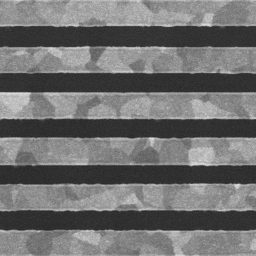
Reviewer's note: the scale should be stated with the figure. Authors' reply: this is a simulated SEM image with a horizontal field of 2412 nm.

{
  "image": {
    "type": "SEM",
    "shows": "lines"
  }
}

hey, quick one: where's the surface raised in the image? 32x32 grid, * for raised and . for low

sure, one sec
********************************
********************************
********************************
................................
................................
................................
********************************
********************************
********************************
................................
................................
................................
********************************
********************************
********************************
................................
................................
********************************
********************************
********************************
********************************
................................
................................
********************************
********************************
********************************
................................
................................
................................
********************************
********************************
********************************